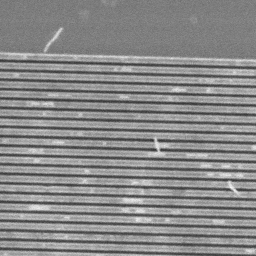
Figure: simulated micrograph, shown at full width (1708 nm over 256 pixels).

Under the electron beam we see parallel lines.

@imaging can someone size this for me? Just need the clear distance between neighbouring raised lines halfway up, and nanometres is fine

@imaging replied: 26.7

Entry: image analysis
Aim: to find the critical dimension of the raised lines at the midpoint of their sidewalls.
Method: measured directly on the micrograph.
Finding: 33.3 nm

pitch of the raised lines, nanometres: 62.7